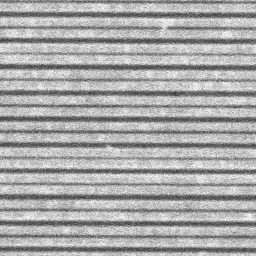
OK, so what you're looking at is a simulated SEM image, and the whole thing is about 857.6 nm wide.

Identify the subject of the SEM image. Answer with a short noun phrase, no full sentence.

parallel lines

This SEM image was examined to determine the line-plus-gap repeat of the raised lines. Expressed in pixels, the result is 13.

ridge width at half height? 28.1 nanometers